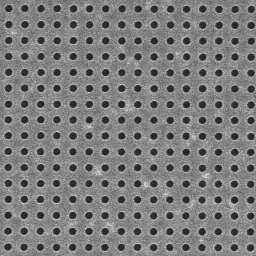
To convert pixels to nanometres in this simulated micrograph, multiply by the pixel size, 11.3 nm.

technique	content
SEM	a regular array of holes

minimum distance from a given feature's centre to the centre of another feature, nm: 178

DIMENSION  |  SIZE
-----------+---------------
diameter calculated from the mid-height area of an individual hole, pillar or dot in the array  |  85.3 nm